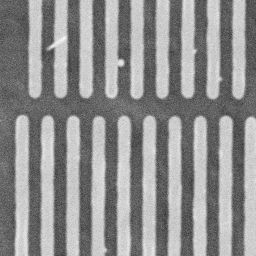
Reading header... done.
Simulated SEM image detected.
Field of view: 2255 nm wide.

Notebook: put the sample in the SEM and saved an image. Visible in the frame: groups of lines, slits or small figures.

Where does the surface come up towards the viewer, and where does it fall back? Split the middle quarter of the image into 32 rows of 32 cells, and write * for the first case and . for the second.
*...***....**....***...***....**
*...***....**....***...***....**
*...***....**....**....***....**
*...***....**....**....***....**
*...***....**....**....***....**
*...***....**....**....***....**
*...***....**....**....***....**
*...***....**....**....***....**
..................*.....*.......
................................
................................
................................
................................
.**.....**....**....**.....*....
.**.....**....**....***...***...
.**....***....***...***...***...
.***...***....***...***...***...
.***...***....***...***...***...
.***...***....**....***...***...
.***...***....**....***...***...
.***...***....**....***...***...
.**....***....**....***...***...
.***...***....**....***...***...
.***...***....**....***...***...
.***...***....**....***...***...
.**....***....**....***...***...
.**....***....**....***...***...
.**....***....**....***...***...
.**....***....**....***...***...
.**....***....**....***...***...
.**....***....**....***...***...
.**....***....**....***...***...